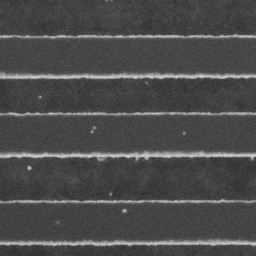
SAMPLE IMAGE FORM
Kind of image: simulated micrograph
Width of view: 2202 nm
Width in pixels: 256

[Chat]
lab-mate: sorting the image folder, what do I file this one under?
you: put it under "lines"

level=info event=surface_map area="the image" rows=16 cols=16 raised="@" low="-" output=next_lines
----------------
----------------
@@@@@@@@@@@@@@@@
@@@@@@@@@@@@@@@@
@@@@@@@@@@@@@@@@
----------------
----------------
@@@@@@@@@@@@@@@@
@@@@@@@@@@@@@@@@
@@@@@@@@@@@@@@@@
----------------
----------------
----------------
@@@@@@@@@@@@@@@@
@@@@@@@@@@@@@@@@
----------------